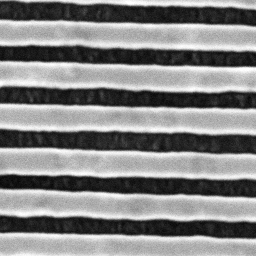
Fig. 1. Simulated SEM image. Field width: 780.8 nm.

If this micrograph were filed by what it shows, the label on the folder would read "lines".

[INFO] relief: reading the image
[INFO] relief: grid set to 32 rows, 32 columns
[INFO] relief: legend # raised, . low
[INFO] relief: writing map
..........##..##################
................................
................................
################################
################################
################################
................................
................................
################################
################################
################################
.........................##.....
................................
###################.#...........
################################
################################
..................##############
................................
................................
################################
################################
################################
................................
................................
##########################......
################################
################################
......................##...#####
................................
################.#..............
################################
################################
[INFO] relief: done